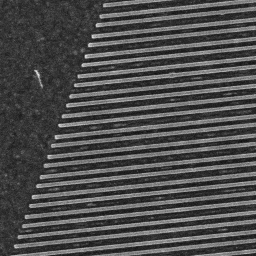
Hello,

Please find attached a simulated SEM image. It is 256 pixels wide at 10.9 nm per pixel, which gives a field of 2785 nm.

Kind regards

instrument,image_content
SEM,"parallel lines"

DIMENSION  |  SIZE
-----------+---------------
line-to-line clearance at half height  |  59.5 nanometers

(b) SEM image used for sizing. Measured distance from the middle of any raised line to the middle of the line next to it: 104 nm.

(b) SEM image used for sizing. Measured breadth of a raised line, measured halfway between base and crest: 39.2 nanometers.